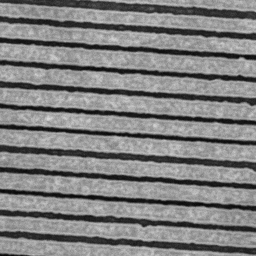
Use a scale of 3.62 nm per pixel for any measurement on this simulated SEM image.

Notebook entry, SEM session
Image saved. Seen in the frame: parallel lines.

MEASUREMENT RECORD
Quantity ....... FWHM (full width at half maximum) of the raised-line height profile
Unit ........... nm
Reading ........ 53.7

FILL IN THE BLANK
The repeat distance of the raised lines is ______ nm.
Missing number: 77.1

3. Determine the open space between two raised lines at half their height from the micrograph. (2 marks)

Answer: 6.1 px